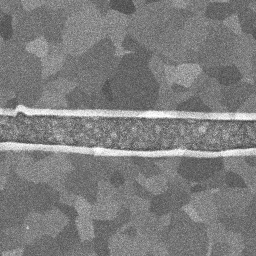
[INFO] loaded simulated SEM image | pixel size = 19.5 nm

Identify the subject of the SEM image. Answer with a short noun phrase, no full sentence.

one or a few lines or trenches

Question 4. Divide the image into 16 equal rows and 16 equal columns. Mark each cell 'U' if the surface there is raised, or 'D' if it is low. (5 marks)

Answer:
UUUUUUUUUUUUUUUU
UUUUUUUUUUUUUUUU
UUUUUUUUUUUUUUUU
UUUUUUUUUUUUUUUU
UUUUUUUUUUUUUUUU
UUUUUUUUUUUUUUUU
UUUUUUUUUUUUUUUU
DDDDDDDDDDDDDDDD
DDDDDDDDDDDDDDDD
UUUUUUUDDDDDDDDU
UUUUUUUUUUUUUUUU
UUUUUUUUUUUUUUUU
UUUUUUUUUUUUUUUU
UUUUUUUUUUUUUUUU
UUUUUUUUUUUUUUUU
UUUUUUUUUUUUUUUU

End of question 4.